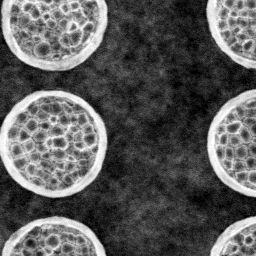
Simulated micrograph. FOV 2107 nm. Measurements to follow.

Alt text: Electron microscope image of raised bodies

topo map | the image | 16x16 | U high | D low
UUUUUUDDDDDDDUUU
UUUUUUDDDDDDDUUU
DUUUUUDDDDDDDDUU
DUUUUDDDDDDDDDDU
DDDDDDDDDDDDDDDD
DDDDDDDDDDDDDDDD
DUUUUDDDDDDDDDDU
DUUUUUDDDDDDDDUU
UUUUUUDDDDDDDUUU
UUUUUUDDDDDDDUUU
DUUUUUDDDDDDDDUU
DDUUUDDDDDDDDDDU
DDDDDDDDDDDDDDDD
DDDDDDDDDDDDDDDD
DUUUUDDDDDDDDDUU
DUUUUUDDDDDDDDUU